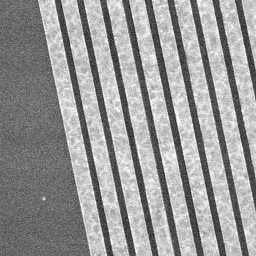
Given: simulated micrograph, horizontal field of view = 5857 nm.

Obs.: parallel lines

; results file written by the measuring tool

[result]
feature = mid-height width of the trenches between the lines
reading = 0.165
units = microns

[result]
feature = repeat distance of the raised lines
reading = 507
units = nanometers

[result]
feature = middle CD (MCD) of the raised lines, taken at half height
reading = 347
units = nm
